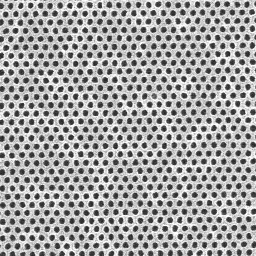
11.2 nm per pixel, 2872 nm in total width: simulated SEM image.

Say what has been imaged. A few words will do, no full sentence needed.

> a regular array of holes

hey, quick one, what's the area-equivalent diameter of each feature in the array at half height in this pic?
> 5.86 px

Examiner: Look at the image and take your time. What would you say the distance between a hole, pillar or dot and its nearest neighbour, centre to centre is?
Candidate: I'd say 104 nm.